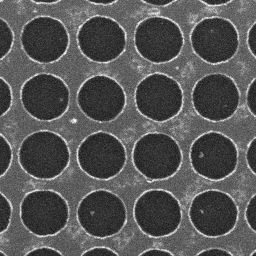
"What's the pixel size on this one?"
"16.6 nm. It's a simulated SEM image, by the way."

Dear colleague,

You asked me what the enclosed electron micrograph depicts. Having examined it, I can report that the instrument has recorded a regular array of holes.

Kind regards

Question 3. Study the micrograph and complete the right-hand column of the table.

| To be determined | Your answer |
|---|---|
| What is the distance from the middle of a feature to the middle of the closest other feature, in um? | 0.931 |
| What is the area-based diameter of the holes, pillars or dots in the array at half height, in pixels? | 47.1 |